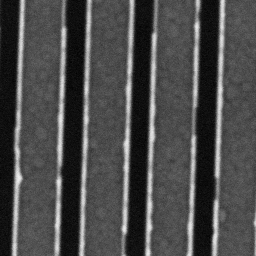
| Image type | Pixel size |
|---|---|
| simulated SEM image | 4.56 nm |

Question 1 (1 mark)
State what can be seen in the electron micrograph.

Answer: one or a few lines or trenches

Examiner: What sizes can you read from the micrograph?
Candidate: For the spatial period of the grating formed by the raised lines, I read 304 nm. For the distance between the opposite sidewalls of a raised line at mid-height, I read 124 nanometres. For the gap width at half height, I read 0.178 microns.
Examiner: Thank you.